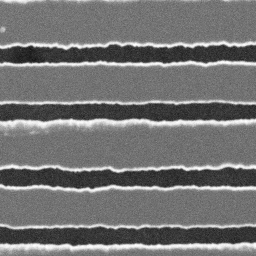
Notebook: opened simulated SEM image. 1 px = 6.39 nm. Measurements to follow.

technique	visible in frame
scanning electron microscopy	lines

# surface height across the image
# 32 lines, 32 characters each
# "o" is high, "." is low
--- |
oooooooooooooooooooooooooooooooo
oooooooooooooooooooooooooooooooo
oooooooooooooooooooooooooooooooo
oooooooooooooooooooooooooooooooo
oooooooooooooooooooooooooooooooo
oooooooooooooo.oooooooooooooooo.
................................
................................
oooooooooooooooooooooooooooooooo
oooooooooooooooooooooooooooooooo
oooooooooooooooooooooooooooooooo
oooooooooooooooooooooooooooooooo
oooooooooooooooooooooooooooooooo
................................
................................
oooooooooooooooooooooooooooooooo
oooooooooooooooooooooooooooooooo
oooooooooooooooooooooooooooooooo
oooooooooooooooooooooooooooooooo
oooooooooooooooooooooooooooooooo
oooooooooooooooooooooooooooooooo
................................
................................
oooooooo.....ooooooo.oooooooo.oo
oooooooooooooooooooooooooooooooo
oooooooooooooooooooooooooooooooo
oooooooooooooooooooooooooooooooo
oooooooooooooooooooooooooooooooo
.oo.............................
................................
..............................oo
oooooooooooooooooooooooooooooooo